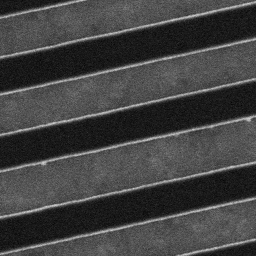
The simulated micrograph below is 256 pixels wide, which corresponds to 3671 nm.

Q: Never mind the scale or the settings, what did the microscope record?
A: lines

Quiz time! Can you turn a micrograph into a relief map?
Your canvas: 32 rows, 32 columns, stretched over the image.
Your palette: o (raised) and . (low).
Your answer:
oooooooo.......................o
oooo......................oooooo
.....................ooooooooooo
.................ooooooooooooooo
............oooooooooooooooooooo
........ooooooooooooooooooooo...
...oooooooooooooooooooooo.......
oooooooooooooooooooo............
oooooooooooooooo................
ooooooooooo.....................
oooooo.......................ooo
oo......................oooooooo
....................oooooooooooo
...............ooooooooooooooooo
...........ooooooooooooooooooooo
......oooooooooooooooooooooo....
.oooooooooooooooooooooo.........
ooooooooooooooooooo.............
oooooooooooooo..................
ooooooooo.......................
ooooo.........................oo
..........................oooooo
......................oooooooooo
.................ooooooooooooooo
............oooooooooooooooooooo
.......oooooooooooooooooooooo...
...oooooooooooooooooooooo.......
oooooooooooooooooooo............
ooooooooooooooo.................
ooooooooooo.....................
oooooo.......................ooo
oo......................oooooooo